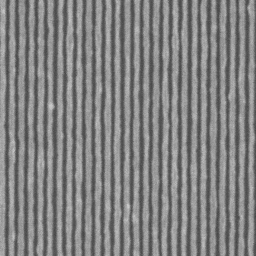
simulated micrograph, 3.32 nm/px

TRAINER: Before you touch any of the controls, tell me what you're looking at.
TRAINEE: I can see parallel lines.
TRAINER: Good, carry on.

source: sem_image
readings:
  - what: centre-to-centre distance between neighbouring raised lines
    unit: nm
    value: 31.8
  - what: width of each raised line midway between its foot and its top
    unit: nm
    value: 15.3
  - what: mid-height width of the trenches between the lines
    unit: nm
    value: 18.7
